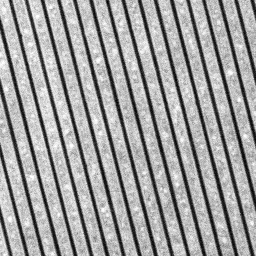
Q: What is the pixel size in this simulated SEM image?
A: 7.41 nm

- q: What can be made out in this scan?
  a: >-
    parallel lines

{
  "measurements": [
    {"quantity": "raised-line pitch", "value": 0.116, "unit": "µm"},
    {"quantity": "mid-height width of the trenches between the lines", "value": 35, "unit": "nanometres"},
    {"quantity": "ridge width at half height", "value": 83.5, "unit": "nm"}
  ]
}